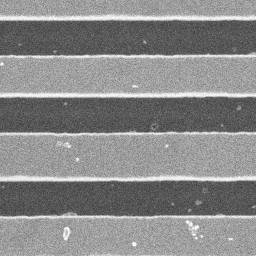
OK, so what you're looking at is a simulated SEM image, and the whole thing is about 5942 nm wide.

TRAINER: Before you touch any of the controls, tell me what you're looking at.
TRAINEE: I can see lines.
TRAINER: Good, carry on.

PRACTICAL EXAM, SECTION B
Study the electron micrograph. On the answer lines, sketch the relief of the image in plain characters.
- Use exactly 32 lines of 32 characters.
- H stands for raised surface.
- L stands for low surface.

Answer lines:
HHHHHHHHHHHHHHHHHHHHHHHHHHHHHHHH
HHHHHHHHHHHHHHHHHHHHHHHHHHHHHHHH
LLLLLLLLLLLLLLLLLLLLLLLLLLLLLLLL
LLLLLLLLLLLLLLLLLLLLLLLLLLLLLLLL
LLLLLLLLLLLLLLLLLLLLLLLLLLLLLLLL
LLLLLLLLLLLLLLLLLLLLLLLLLLLLLLLL
LLLLLLLLLLLLLLLLLLLLLLLLLLLLLLLL
HHHHHHHHHHHHHHHHHHHHHHHHHHHHHHHH
HHHHHHHHHHHHHHHHHHHHHHHHHHHHHHHH
HHHHHHHHHHHHHHHHHHHHHHHHHHHHHHHH
HHHHHHHHHHHHHHHHHHHHHHHHHHHHHHHH
HHHHHHHHHHHHHHHHHHHHHHHHHHHHHHHH
LLLLLLLLLLLLLLLLLLLLLLLLLLLLLLLL
LLLLLLLLLLLLLLLLLLLLLLLLLLLLLLLL
LLLLLLLLLLLLLLLLLLLLLLLLLLLLLLLL
LLLLLLLLLLLLLLLLLLLLLLLLLLLLLLLL
LLLLLLLLLLLLLLLLLLLLLLLLLLLLLLLL
HHHHHHHHHHHHHHHHHHHHHHHHHHHHHHHH
HHHHHHHHHHHHHHHHHHHHHHHHHHHHHHHH
HHHHHHHHHHHHHHHHHHHHHHHHHHHHHHHH
HHHHHHHHHHHHHHHHHHHHHHHHHHHHHHHH
HHHHHHHHHHHHHHHHHHHHHHHHHHHHHHHH
HHHHHHHHHHHHHLHHHHLLLLLLLLLHHLLL
LLLLLLLLLLLLLLLLLLLLLLLLLLLLLLLL
LLLLLLLLLLLLLLLLLLLLLLLLLLLLLLLL
LLLLLLLLLLLLLLLLLLLLLLLLLLLLLLLL
LLLLLLLLLLLLLLLLLLLLLLLLLLLLLLLL
HHHHHHHHHHHHHHHHHHHHHHHHHHHHHHHH
HHHHHHHHHHHHHHHHHHHHHHHHHHHHHHHH
HHHHHHHHHHHHHHHHHHHHHHHHHHHHHHHH
HHHHHHHHHHHHHHHHHHHHHHHHHHHHHHHH
HHHHHHHHHHHHHHHHHHHHHHHHHHHHHHHH